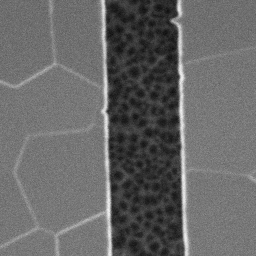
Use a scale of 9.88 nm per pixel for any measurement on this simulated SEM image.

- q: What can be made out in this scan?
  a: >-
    one or a few lines or trenches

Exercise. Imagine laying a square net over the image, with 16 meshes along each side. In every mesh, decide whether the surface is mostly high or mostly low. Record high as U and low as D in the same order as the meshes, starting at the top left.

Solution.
UUUUUUDDDDDUUUUU
UUUUUUUDDDDUUUUU
UUUUUUDDDDDUUUUU
UUUUUUUDDDDUUUUU
UUUUUUUDDDDUUUUU
UUUUUUUDDDDUUUUU
UUUUUUUDDDDUUUUU
UUUUUUUDDDDUUUUU
UUUUUUUDDDDUUUUU
UUUUUUUDDDDUUUUU
UUUUUUUDDDDUUUUU
UUUUUUUDDDDUUUUU
UUUUUUUDDDDUUUUU
UUUUUUUDDDDDUUUU
UUUUUUUDDDDDUUUU
UUUUUUUDDDDDUUUU